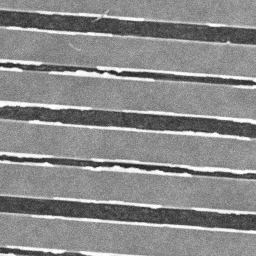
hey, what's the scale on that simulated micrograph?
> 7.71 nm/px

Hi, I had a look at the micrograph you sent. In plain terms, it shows parallel lines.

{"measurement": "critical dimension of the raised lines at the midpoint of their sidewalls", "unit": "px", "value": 35.2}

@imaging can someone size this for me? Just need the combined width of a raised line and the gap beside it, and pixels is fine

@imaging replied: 45.2